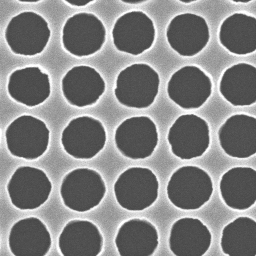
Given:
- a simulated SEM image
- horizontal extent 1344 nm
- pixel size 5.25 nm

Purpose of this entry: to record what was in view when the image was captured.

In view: a regular array of holes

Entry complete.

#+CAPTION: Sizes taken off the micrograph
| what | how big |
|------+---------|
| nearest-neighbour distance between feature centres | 269 nm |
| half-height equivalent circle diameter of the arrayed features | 0.226 um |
